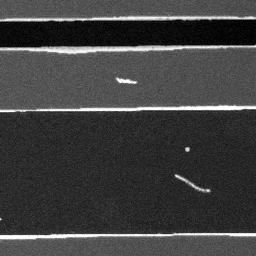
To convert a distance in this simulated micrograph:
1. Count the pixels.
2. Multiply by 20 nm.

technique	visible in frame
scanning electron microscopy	lines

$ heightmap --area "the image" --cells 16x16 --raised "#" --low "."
################
................
................
################
################
################
################
................
................
................
................
................
................
................
................
################